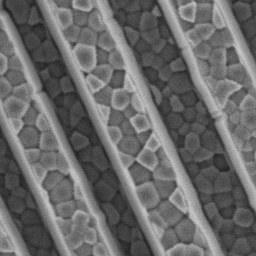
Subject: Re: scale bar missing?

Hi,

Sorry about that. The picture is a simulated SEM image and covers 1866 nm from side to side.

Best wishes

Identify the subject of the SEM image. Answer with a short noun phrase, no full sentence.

one or a few lines or trenches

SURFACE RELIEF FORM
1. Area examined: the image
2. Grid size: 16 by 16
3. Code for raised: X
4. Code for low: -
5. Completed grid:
---XXXX---XXXX--
X--XXXX----XXXX-
X---XXXX---XXXX-
X---XXXX----XXX-
XX---XXX----XXXX
XX---XXXX----XXX
XXX---XXX----XXX
XXX---XXXX----XX
-XXX---XXX----XX
-XXX---XXXX----X
--XXX--XXXX----X
--XXX---XXXX----
---XXX--XXXX----
---XXX---XXX----
X--XXXX--XXXX---
X---XXX---XXX---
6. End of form